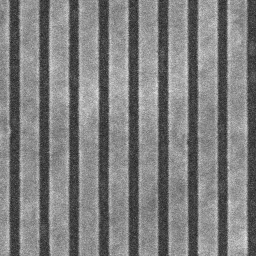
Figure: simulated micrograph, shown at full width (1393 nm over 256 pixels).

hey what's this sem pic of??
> parallel lines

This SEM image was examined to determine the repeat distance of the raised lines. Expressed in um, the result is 0.162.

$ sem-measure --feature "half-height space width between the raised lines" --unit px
11.2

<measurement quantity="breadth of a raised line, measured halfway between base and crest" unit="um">0.104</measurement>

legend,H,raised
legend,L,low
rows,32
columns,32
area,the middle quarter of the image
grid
HLLLHHHHHLLHHHHHLLLHHHHLLLHHHHHL
HLLLHHHHHLLHHHHHLLLHHHHLLLHHHHHL
HLLLHHHHHLLHHHHHLLLHHHHLLLHHHHHL
HLLLHHHHHLLHHHHHLLLHHHHLLLHHHHHL
HLLLHHHHHLLHHHHHLLLHHHHLLLHHHHHL
HLLLHHHHHLLHHHHHLLLHHHHLLLHHHHHL
HLLLHHHHHLLHHHHHLLLHHHHLLLHHHHHL
HLLLHHHHHLLHHHHHLLLHHHHLLLHHHHHL
HLLLHHHHHLLHHHHHLLLHHHHLLLHHHHHL
HLLLHHHHHLLHHHHHLLLHHHHLLLHHHHHL
HLLLHHHHHLLHHHHHLLLHHHHLLLHHHHHL
HLLLHHHHHLLHHHHHLLLHHHHLLLHHHHHL
HLLLHHHHHLLHHHHHLLLHHHHLLLHHHHHL
HLLLHHHHHLLHHHHHLLLHHHHLLLHHHHHL
HLLLHHHHHLLHHHHHLLLHHHHLLLHHHHHL
HLLLHHHHHLLHHHHHLLLHHHHLLLHHHHHL
HLLLHHHHHLLHHHHHLLLHHHHLLLHHHHHL
HLLLHHHHHLLHHHHHLLLHHHHLLLHHHHHL
HLLLHHHHHLLHHHHHLLLHHHHLLLHHHHHL
HLLLHHHHHLLHHHHHLLLHHHHLLLHHHHHL
HLLLHHHHHLLHHHHHLLLHHHHLLLHHHHHL
HLLLHHHHHLLHHHHHLLLHHHHLLLHHHHHL
HLLLHHHHHLLHHHHHLLLHHHHLLLHHHHHL
HLLLHHHHLLLHHHHHLLLHHHHLLLHHHHHL
HLLLHHHHLLLHHHHHLLLHHHHLLLHHHHHL
HLLLHHHHLLLHHHHHLLLHHHHLLLHHHHHL
HLLLHHHHLLLHHHHHLLLHHHHLLLHHHHHL
HLLLHHHHLLLHHHHHLLLHHHHLLLHHHHHL
HLLLHHHHLLLHHHHHLLLHHHHLLLHHHHHL
HLLLHHHHLLLHHHHHLLLHHHHLLLHHHHHL
HLLLHHHHLLLHHHHHLLLHHHHLLLHHHHHL
HLLLHHHHLLLHHHHHLLLHHHHLLLHHHHHL